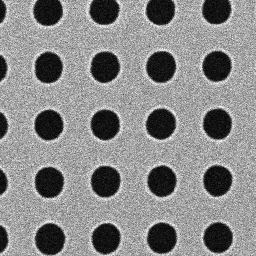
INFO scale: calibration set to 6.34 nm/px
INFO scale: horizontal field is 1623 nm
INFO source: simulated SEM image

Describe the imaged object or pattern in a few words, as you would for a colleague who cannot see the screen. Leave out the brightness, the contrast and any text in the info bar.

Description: a regular array of holes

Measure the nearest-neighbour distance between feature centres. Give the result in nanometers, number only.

354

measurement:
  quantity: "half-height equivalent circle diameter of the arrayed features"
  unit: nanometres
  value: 196